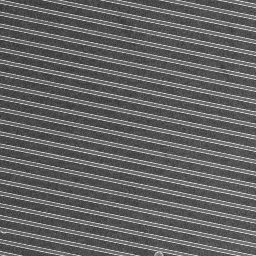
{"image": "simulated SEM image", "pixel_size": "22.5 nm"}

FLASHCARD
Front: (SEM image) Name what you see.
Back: parallel lines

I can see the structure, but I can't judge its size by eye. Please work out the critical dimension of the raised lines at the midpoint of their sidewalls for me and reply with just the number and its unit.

82.8 nanometres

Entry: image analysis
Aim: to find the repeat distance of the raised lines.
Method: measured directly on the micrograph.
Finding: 264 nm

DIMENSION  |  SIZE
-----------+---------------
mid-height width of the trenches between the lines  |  179 nm